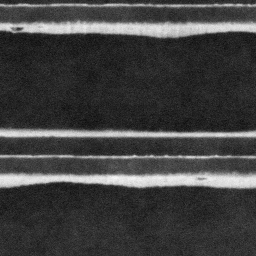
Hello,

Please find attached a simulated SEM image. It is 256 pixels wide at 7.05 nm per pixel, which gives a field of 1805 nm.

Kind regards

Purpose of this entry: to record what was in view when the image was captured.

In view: lines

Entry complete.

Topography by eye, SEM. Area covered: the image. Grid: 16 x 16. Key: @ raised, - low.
@@@@@@@@@@@@@@@@
@@@@@@@@@@@@@@@@
----------------
----------------
----------------
----------------
----------------
----------------
@@@@@@@---------
@@@@@@@@@@@@@@@@
@@@@@@@@@@@@@@@@
----------------
----------------
----------------
----------------
----------------